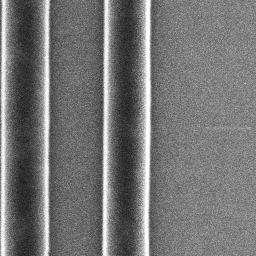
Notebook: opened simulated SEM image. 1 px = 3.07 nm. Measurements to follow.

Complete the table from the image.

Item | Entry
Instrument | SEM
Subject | one or a few lines or trenches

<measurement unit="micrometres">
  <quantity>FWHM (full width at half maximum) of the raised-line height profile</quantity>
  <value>0.136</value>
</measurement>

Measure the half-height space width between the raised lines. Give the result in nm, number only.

178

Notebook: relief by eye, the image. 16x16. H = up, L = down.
HHHLLLLHHLLLLLLL
HHHLLLLHHLLLLLLL
HHHLLLLHHLLLLLLL
HHHLLLLHHLLLLLLL
HHHLLLLHHLLLLLLL
HHHLLLLHHLLLLLLL
HHHLLLLHHLLLLLLL
HHHLLLLHHLLLLLLL
HHHLLLLHHLLLLLLL
HHHLLLLHHLLLLLLL
HHHLLLLHHLLLLLLL
HHHLLLLHHLLLLLLL
HHHLLLLHHLLLLLLL
HHHLLLLHHLLLLLLL
HHHLLLLHHLLLLLLL
HHHLLLLHHLLLLLLL